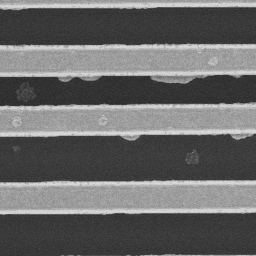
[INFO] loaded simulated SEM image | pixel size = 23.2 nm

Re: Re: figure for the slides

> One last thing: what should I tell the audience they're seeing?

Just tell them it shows lines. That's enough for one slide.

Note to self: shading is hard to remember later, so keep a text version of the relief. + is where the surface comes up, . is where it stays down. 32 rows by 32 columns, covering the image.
++++++++++++++++++++++++++++++++
................................
................................
................................
................................
................................
++++++++++++++++++++++++++++++++
++++++++++++++++++++++++++++++++
++++++++++++++++++++++++++++++++
+++++++.........................
................................
................................
................................
++++++++++++++++++++++++++++++++
++++++++++++++++++++++++++++++++
++++++++++++++++++++++++++++++++
++++++++++++++++++++++++++++++++
................................
................................
................................
................................
................................
................................
++++++++++++++++++++++++++++++++
++++++++++++++++++++++++++++++++
++++++++++++++++++++++++++++++++
+++++++++++++++++++++++++.......
................................
................................
................................
................................
................................